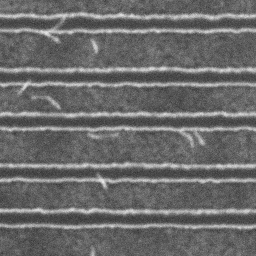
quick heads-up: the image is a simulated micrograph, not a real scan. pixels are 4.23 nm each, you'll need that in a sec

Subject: lines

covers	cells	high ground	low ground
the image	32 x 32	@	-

--------------------------------
--------------------------------
@@@@@@@@@@@@@@@@@@@@@@@@@@@@@@@@
@@@@@@@@@@@@@@@@@@@@@@@@@@@@@@@@
--------------------------------
--------------------------------
--------------------------------
--------------------------------
-------------------@@-----------
@@@@@@@@@@@@@@@@@@@@@@@@@@@@@@@@
@@@@@@@@@@@@@@@@@@@@@@@@@@@@@@@@
--------------------------------
--------------------------------
--------------------------------
@@@@@@@@@@@@@@@@@@@@@@@@@@@@@@@@
@@@@@@@@@@@@@@@@@@@@@@@@@@@@@@@@
--------------------------------
--------------------------------
--------------------------------
--------------------------------
--------------@@@@--@@----------
@@@@@@@@@@@@@@@@@@@@@@@@@@@@@@@@
@@@@@@@@@@@@@@@@@@@@@@@@@@@@@@@@
--------------------------------
--------------------------------
--------------------------------
@@@@@@@@@@@@@@@@@@@@@@@@@@@@@@@@
@@@@@@@@@@@@@@@@@@@@@@@@@@@@@@@@
--------------------------------
--------------------------------
--------------------------------
--------------------------------